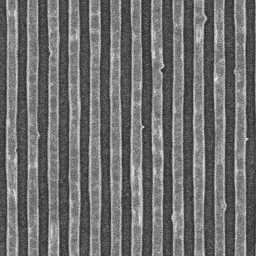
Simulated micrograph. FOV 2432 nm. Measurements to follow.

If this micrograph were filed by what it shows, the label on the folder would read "parallel lines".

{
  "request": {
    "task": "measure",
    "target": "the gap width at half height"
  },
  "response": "99.7 nm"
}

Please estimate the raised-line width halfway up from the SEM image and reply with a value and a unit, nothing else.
98.5 nm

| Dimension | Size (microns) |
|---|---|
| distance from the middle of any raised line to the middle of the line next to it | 0.197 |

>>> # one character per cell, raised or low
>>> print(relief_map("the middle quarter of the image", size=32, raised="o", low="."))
.ooo...oo...oo...oo...ooo...oo..
.ooo...oo...oo...oo...oo....oo..
.ooo...oo...oo...oo...ooo...oo..
.ooo...oo...oo...oo...ooo...oo..
.ooo...oo...oo...oo...ooo...oo..
.ooo...oo...oo...oo...ooo..ooo..
.ooo...oo...oo...oo...ooo..ooo..
.ooo...oo...oo...oo...ooo..ooo..
..oo...oo...oo...oo...ooo..ooo..
..oo...oo...oo...oo...ooo..ooo..
..oo...oo...oo...oo...ooo..ooo..
..oo...oo...oo...oo...ooo..ooo..
..oo...oo...oo...oo...oo...ooo..
..oo...oo...oo...oo...oo...ooo..
..oo...oo...oo...oo...oo...ooo..
..oo...oo...oo...ooo..ooo..ooo..
..oo...oo...oo...oo...ooo..ooo..
.ooo...oo...oo...oo...ooo..ooo..
.ooo...oo...oo...oo...ooo..ooo..
.ooo..ooo...oo...oo...ooo..ooo..
..oo..ooo...oo...oo...ooo..ooo..
.ooo..ooo...oo...oo...ooo..ooo..
.ooo..ooo...oo...oo...ooo..ooo..
.ooo..ooo...oo...oo...ooo..ooo..
.ooo..ooo...oo...oo...ooo..ooo..
.ooo..ooo...oo...oo...ooo..ooo..
.ooo..ooo...oo...oo...ooo..ooo..
.ooo..ooo...oo...oo...ooo..ooo..
.ooo..ooo...oo...oo...ooo..ooo..
.ooo..ooo...oo...oo...ooo..ooo..
.ooo..ooo...oo...oo...ooo..ooo..
.ooo..ooo...oo...ooo..ooo..ooo..